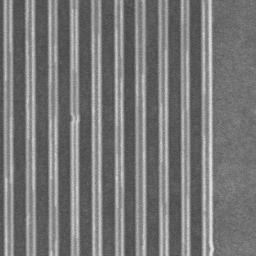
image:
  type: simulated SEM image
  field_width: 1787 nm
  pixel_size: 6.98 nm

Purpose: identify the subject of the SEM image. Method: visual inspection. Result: parallel lines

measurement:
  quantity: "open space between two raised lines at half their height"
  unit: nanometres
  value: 104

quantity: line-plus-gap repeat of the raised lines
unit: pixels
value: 22.1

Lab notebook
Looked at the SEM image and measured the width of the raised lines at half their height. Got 52.4 nanometres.